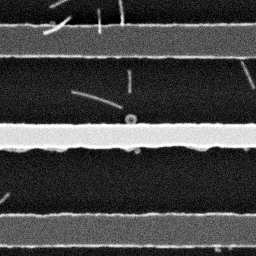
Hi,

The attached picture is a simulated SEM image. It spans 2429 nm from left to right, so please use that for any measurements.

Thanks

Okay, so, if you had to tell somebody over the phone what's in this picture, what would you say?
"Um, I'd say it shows lines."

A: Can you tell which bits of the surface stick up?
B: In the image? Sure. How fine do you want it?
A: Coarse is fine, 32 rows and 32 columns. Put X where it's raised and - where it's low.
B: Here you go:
--------------------------------
--------------------------------
--------------------------------
XXXXXXXXXXXXXXXXXXXXXXXXXXXXXXXX
XXXXXXXXXXXXXXXXXXXXXXXXXXXXXXXX
XXXXXXXXXXXXXXXXXXXXXXXXXXXXXXXX
XXXXXXXXXXXXXXXXXXXXXXXXXXXXXXXX
--------------------------------
--------------------------------
--------------------------------
--------------------------------
--------------------------------
--------------------------------
--------------------------------
--------------------------------
--------------------------------
XXXXXXXXXXXXXXXXXXXXXXXXXXXXXXXX
XXXXXXXXXXXXXXXXXXXXXXXXXXXXXXXX
--------------------------------
--------------------------------
--------------------------------
--------------------------------
--------------------------------
--------------------------------
--------------------------------
--------------------------------
--------------------------------
XXXXXXXXXXXXXXXXXXXXXXXXXXXXXXXX
XXXXXXXXXXXXXXXXXXXXXXXXXXXXXXXX
XXXXXXXXXXXXXXXXXXXXXXXXXXXXXXXX
XXXXXXXXXXXXXXXXXXXXXXXXXXXXXXXX
--------------------------------